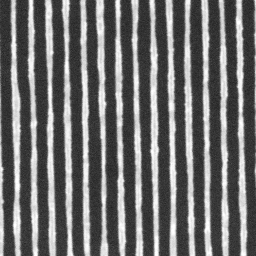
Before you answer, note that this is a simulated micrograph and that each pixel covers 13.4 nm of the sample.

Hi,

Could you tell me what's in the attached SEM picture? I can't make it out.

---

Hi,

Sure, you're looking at parallel lines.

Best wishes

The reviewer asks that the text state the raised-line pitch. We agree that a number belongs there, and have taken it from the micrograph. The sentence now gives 232 nanometers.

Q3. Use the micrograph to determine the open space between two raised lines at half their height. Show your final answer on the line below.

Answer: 179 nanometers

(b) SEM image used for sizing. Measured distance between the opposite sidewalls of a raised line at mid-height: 0.0551 micrometres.